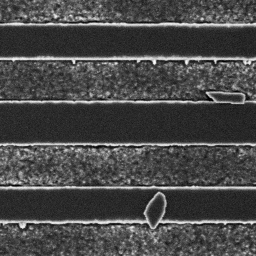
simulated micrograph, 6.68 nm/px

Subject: lines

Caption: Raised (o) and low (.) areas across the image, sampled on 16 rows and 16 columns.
................
oo.o.o....o.....
oooooooooooooooo
oooooooooooooooo
................
................
oooooooooooooooo
oooooooooooooooo
oooooooooooooooo
................
................
................
oooooooooooooooo
oooooooooooooooo
................
................